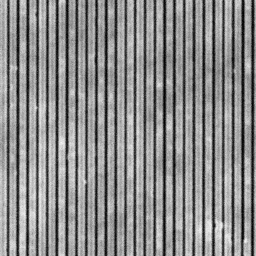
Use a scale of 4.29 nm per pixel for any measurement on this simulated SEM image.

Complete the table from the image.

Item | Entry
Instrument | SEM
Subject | parallel lines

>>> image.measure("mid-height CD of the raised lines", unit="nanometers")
27.3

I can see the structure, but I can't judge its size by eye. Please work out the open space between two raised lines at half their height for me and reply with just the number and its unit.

3.61 pixels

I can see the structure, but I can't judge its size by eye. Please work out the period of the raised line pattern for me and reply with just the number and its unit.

41.9 nm